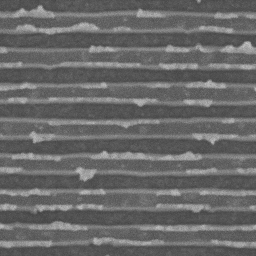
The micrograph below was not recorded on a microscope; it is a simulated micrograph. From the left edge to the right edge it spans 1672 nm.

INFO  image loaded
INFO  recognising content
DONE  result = parallel lines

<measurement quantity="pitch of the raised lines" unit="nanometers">232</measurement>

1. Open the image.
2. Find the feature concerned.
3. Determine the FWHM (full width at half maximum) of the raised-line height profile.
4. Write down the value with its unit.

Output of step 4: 119 nm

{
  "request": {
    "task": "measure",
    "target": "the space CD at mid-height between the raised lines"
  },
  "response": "113 nm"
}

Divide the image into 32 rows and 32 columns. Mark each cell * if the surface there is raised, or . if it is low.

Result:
................................
..****...........*..............
********************************
********************************
................................
..............................*.
********************************
********************************
.....................****.....**
................................
............**....**...*****....
********************************
**********.*********************
................................
................................
********************************
********************************
....**....................*.....
................................
*****....**********.*****.......
********************************
.*.....*****...*****************
..........*.....................
................................
********************************
********************************
................................
................................
********************************
********************************
*******..........****......*****
................................